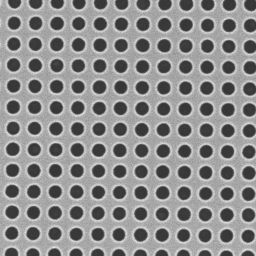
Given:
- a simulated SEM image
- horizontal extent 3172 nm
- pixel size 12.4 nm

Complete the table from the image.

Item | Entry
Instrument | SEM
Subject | a regular array of holes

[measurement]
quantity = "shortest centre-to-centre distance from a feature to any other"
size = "259 nm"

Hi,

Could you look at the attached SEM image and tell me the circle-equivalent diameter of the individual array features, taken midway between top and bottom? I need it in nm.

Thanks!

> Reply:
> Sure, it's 170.